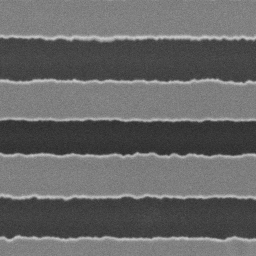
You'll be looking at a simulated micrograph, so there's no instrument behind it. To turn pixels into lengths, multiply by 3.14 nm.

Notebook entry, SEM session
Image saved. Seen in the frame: lines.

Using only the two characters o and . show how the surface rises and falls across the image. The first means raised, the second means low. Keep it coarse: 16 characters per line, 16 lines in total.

oooooooooooooooo
oooooooooooooooo
................
................
................
oooooooooooooooo
oooooooooooooooo
..ooo..ooooooooo
................
................
oooooooooooooooo
oooooooooooooooo
................
................
................
oooooooooooooooo